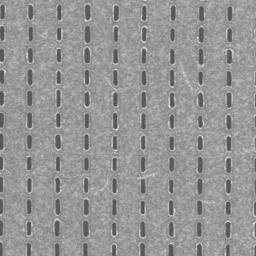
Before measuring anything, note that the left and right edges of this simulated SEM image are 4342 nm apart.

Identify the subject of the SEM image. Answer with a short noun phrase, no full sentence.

a regular array of holes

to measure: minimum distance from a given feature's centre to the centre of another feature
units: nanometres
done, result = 363